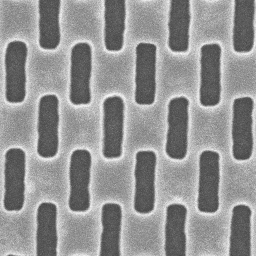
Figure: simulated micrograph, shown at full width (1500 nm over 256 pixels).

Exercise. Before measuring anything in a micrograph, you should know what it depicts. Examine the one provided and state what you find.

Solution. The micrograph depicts a regular array of holes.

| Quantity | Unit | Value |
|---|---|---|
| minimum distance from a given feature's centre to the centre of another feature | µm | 0.367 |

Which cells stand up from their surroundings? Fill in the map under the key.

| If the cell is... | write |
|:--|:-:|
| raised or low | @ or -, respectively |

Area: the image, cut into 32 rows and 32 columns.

@@@@@---@@@@@---@@@@@---@@@@@---
@@@@@--@@@@@@---@@@@@---@@@@@---
@@@@@--@@@@@@---@@@@@---@@@@@---
@@@@@--@@@@@@---@@@@@---@@@@@---
@@@@@---@@@@@---@@@@@---@@@@@---
@--@@--@@@-@@--@@--@@---@@-@@---
@--@@@@@@--@@@@@@---@@-@@---@@-@
@--@@@@@@---@@@@@---@@@@@---@@@@
@--@@@@@@--@@@@@@---@@@@@---@@@@
@--@@@@@@--@@@@@@--@@@@@@---@@@@
@--@@@@@@--@@@@@@--@@@@@@---@@@@
@--@@@@@@--@@@@@@--@@@@@@---@@@@
@--@@--@@--@@--@@--@@---@--@@@--
@@@@@--@@@@@@---@@@@@---@@@@@---
@@@@@--@@@@@@---@@@@@---@@@@@---
@@@@@--@@@@@@--@@@@@@---@@@@@---
@@@@@--@@@@@@--@@@@@@---@@@@@---
@@@@@--@@@@@@--@@@@@@--@@@@@@---
@-@@@--@@@@@@--@@@@@@--@@@@@@---
@--@@--@@--@@--@@--@@--@@--@@--@
@--@@@@@@--@@@@@@--@@@@@@--@@@@@
@--@@@@@@--@@@@@@--@@@@@@---@@@@
@--@@@@@@--@@@@@@--@@@@@@---@@@@
@--@@@@@@--@@@@@@--@@@@@@--@@@@@
---@@@@@@--@@@@@@--@@@@@@--@@@@@
@--@@--@@--@@--@@--@@@@@@--@@@@@
@@@@@--@@@@@@--@@--@@--@@--@@--@
@@@@@--@@@@@@--@@@@@@--@@@@@@--@
@@@@@--@@@@@@--@@@@@@--@@@@@@--@
@@@@@--@@@@@@--@@@@@@--@@@@@@--@
@@@@@--@@@@@---@@@@@@--@@@@@@--@
@@@@@--@@@@@---@@@@@@--@@@@@@--@